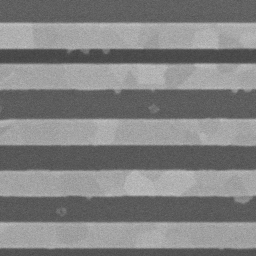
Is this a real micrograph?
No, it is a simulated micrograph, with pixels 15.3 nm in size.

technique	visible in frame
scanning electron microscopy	lines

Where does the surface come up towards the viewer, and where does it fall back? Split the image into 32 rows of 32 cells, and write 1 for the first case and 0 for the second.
00000000000000000000000000000000
00000000000000000000000000000000
00000000000000000000000000000000
11111111111111111111111111111111
11111111111111111111111111111111
11111111111111111111111111111111
00000000000000000000000000000000
00000000000000000000000000000000
11111111111111111111111111111111
11111111111111111111111111111111
11111111111111111111111111111111
00000000000000000000000000000000
00000000000000000000000000000000
00000000000000000000000000000000
00000000000000000000000000000000
11111111111111111111111111111111
11111111111111111111111111111111
11111111111111111111111111111111
00000000000000000000000000000000
00000000000000000000000000000000
00000000000000000000000000000000
11111111111111111111111111111111
11111111111111111111111111111111
11111111111111111111111111111111
11111111001111110000001111011100
00000000000000000000000000000000
00000000000000000000000000000000
00000000000000000000000000000000
11111111111111111111111111111111
11111111111111111111111111111111
11111111111111111111111111111111
00000000000000000000000000000000